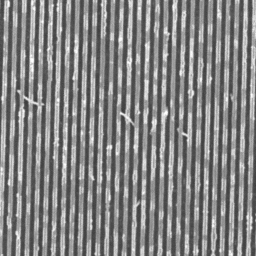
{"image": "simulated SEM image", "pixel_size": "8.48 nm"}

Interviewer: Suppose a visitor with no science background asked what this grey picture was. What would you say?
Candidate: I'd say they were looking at parallel lines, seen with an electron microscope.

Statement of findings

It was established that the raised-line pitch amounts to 75.2 nm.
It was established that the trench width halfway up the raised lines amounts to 41.3 nm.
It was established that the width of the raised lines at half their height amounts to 32.9 nm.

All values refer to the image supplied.